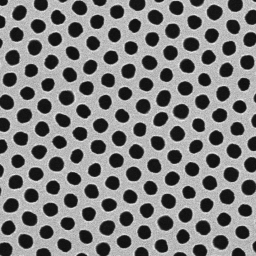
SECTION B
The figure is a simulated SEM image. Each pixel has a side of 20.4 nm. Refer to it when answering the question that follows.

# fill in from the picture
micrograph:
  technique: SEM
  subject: a regular array of holes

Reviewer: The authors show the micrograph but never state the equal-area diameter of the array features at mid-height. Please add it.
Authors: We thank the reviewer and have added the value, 292 nm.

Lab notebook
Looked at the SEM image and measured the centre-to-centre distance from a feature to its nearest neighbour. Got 0.443 microns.